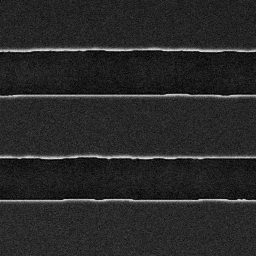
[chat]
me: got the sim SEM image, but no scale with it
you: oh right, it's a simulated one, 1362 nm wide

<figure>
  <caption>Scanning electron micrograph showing lines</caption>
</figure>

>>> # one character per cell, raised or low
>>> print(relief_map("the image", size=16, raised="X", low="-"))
XXXXXXXXXXXXXXXX
XXXXXXXXXXXXXXXX
XXXXXXXXXXXXXXXX
----------------
----------------
----------------
XXXXXXXXXXXXXXXX
XXXXXXXXXXXXXXXX
XXXXXXXXXXXXXXXX
XXXXXXXXXXXXXXXX
----------------
----------------
----XXXXX---XXXX
XXXXXXXXXXXXXXXX
XXXXXXXXXXXXXXXX
XXXXXXXXXXXXXXXX